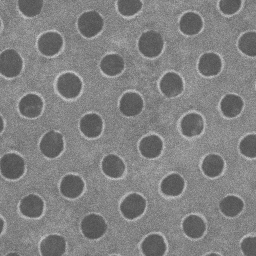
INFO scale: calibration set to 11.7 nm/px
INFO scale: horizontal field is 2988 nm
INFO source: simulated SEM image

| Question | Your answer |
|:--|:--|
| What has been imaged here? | a regular array of raised bodies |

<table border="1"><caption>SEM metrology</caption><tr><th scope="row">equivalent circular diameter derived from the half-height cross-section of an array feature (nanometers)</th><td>309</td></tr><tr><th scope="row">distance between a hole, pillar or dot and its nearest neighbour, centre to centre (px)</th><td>43.7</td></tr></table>